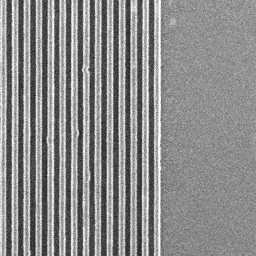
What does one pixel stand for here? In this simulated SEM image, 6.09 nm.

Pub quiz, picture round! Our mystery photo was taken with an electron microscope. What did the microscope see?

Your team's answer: parallel lines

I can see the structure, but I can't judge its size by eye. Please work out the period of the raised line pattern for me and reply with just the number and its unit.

11.9 pixels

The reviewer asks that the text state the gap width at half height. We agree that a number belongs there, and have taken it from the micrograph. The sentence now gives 38.1 nanometres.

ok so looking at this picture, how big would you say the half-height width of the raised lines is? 32.8 nm